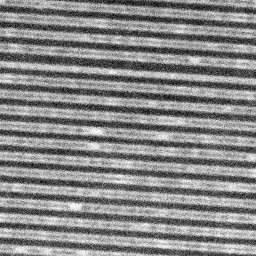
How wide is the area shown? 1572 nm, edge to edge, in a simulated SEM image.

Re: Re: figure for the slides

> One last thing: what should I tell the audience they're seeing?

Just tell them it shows parallel lines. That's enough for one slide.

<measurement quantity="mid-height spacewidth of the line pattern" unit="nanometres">48.2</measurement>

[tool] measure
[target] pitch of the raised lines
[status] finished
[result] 15.4 pixels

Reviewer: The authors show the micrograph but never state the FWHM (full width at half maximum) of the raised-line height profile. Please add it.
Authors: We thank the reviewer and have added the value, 48.2 nanometers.